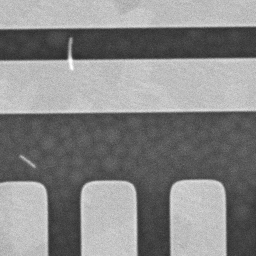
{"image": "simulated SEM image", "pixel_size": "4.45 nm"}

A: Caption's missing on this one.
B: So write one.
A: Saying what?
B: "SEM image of groups of lines, slits or small figures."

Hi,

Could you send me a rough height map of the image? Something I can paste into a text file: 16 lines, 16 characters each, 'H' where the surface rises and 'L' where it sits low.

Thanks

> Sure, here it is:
HHHHHHHHHHHHHHHH
HHHHHHHHHHHHHHHH
LLLLLLLLLLLLLLLL
LLLLLLLLLLLLLLLL
HHHHHHHHHHHHHHHH
HHHHHHHHHHHHHHHH
HHHHHHHHHHHHHHHH
LLLLLLLLLLLLLLLL
LLLLLLLLLLLLLLLL
LLLLLLLLLLLLLLLL
LLLLLLLLLLLLLLLL
HHLLLLHHLLLHHHLL
HHHLLHHHHLLHHHLL
HHHLLHHHHLLHHHLL
HHHLLHHHHLLHHHLL
HHHLLHHHHLLHHHLL